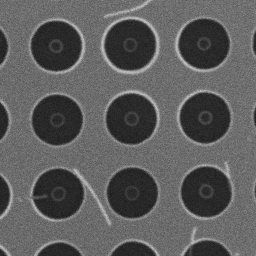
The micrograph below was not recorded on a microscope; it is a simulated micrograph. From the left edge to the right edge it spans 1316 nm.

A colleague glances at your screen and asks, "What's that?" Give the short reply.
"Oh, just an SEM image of an array of small figures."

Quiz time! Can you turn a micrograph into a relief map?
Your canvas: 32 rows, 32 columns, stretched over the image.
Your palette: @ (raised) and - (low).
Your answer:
@@@@@@@@@@@@@@@@@@@@@@@@@@@@@@@@
@@@@@@@@@@@@@@@@@@@@@@@@@@@@@@@@
@@@@@@@@@@@@@@@---@@@@@@---@@@@@
@@@@@----@@@@@-----@@@@-----@@@@
-@@@------@@@-------@@-------@@@
-@@@--@@--@@@---@---@@---@---@@@
-@@@------@@@-------@@-------@@@
-@@@------@@@------@@@@-----@@@@
@@@@@----@@@@@----@@@@@@---@@@@@
@@@@@@@@@@@@@@@@@@@@@@@@@@@@@@@@
@@@@@@@@@@@@@@@@@@@@@@@@@@@@@@@@
@@@@@@@@@@@@@@@@@@@@@@@@@-@@@@@@
@@@@@----@@@@@-----@@@@-----@@@@
-@@@------@@@------@@@@------@@@
-@@@---@--@@@---@---@@---@---@@@
-@@@---@--@@@---@---@@-------@@@
-@@@------@@@@-----@@@@-----@@@@
@@@@@----@@@@@@---@@@@@@---@@@@@
@@@@@@@@@@@@@@@@@@@@@@@@@@@@@@@@
@@@@@@@@@@@@@@@@@@@@@@@@@@@@@@@@
@@@@@@@@@@@@@@@@@@@@@@@@@@@@@@@@
@@@@@----@@@@@@---@@@@@@----@@@@
-@@@@-----@@@@-----@@@@------@@@
-@@@------@@@---@---@@@--@---@@@
-@@@---@---@@---@---@@@--@---@@@
-@@@------@@@@-----@@@@------@@@
-@@@@-----@@@@-----@@@@@----@@@@
@@@@@@@-@@@@@@@@@@@@@@@@@@@@@@@@
@@@@@@@@@@@@@@@@@@@@@@@@@@@@@@@@
@@@@@@@@@@@@@@@@@@@@@@@@@@@@@@@@
@@@@@@---@@@@@@---@@@@@@----@@@@
-@@@@-----@@@@-----@@@@------@@@